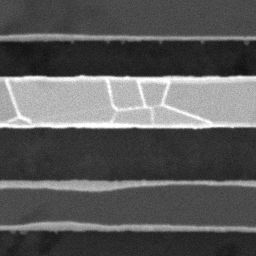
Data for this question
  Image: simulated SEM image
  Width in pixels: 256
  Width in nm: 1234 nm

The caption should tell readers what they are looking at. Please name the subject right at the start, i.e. lines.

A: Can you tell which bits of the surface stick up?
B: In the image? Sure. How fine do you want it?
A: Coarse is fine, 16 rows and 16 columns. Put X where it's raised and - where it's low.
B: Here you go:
XXXXXXXXXXXXXXXX
XXXXXXXXXXXXXXXX
----------------
----------------
----------------
XXXXXXXXXXXXXXXX
XXXXXXXXXXXXXXXX
XXXXXXXXXXXXXXXX
----------------
----------------
----------------
XXX-----XXXXXXXX
XXXXXXXXXXXXXXXX
XXXXXXXXXXXXXXXX
----------------
----------------